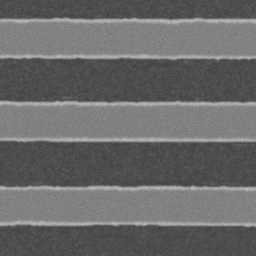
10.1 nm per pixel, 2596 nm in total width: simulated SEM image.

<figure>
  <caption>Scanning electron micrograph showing lines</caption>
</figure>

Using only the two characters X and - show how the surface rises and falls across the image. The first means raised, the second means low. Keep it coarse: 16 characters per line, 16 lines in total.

----------------
XXXXXXXXXXXXXXXX
XXXXXXXXXXXXXXXX
XXXXXXXXXXXXXXXX
----------------
----------------
XXXXXXXXXXXXXXXX
XXXXXXXXXXXXXXXX
XXXXXXXXXXXXXXXX
----------------
----------------
----------------
XXXXXXXXXXXXXXXX
XXXXXXXXXXXXXXXX
----------------
----------------